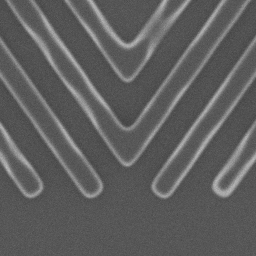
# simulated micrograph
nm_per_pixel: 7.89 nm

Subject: groups of lines, slits or small figures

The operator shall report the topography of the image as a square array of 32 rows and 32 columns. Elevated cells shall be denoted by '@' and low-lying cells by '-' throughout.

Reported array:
-@@@-----@@@--------@@@-----@@@-
--@@@----@@@--------@@-----@@@--
--@@@@----@@@------@@@----@@@---
---@@@-----@@@----@@@-----@@@---
----@@@-----@@----@@-----@@@----
@----@@@----@@@-@@@-----@@@----@
@-----@@-----@@@@@@----@@@@----@
@@----@@@----@@@@@----@@@@----@@
@@@----@@@----@@@@----@@@----@@@
@@@----@@@@----@@----@@@-----@@@
-@@@----@@@---------@@@@----@@@-
-@@@@----@@@--------@@@----@@@@-
--@@@-----@@@------@@@-----@@@--
---@@@-----@@@----@@@@----@@@---
----@@@----@@@----@@@----@@@----
----@@@@----@@@--@@@----@@@@----
@----@@@----@@@@@@@-----@@@----@
@-----@@@----@@@@@@----@@@----@@
@@----@@@@----@@@@----@@@-----@@
@@@----@@@----@@@-----@@@----@@@
-@@@----@@@----@-----@@@-----@@-
-@@@----@@@@--------@@@-----@@@-
--@@@----@@@@------@@@@----@@@--
--@@@-----@@@------@@@-----@@---
---@-------@--------@-----------
--------------------------------
--------------------------------
--------------------------------
--------------------------------
--------------------------------
--------------------------------
--------------------------------